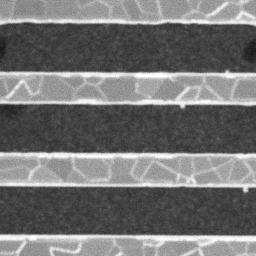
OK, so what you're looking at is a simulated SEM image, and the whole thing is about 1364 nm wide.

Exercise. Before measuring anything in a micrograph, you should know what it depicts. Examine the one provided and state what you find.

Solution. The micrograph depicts one or a few lines or trenches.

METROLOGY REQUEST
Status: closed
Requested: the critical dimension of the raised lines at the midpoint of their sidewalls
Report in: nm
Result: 165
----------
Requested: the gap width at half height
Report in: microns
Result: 0.27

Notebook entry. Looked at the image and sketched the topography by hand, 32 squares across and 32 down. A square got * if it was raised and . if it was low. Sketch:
********************************
********************************
********************************
................................
................................
................................
................................
................................
................................
********************************
********************************
********************************
********************************
................................
................................
................................
................................
................................
................................
********************************
********************************
********************************
********************************
................................
................................
................................
................................
................................
................................
................................
********************************
********************************